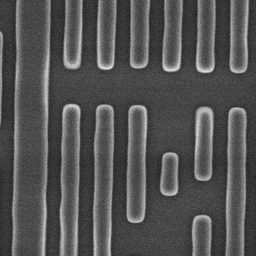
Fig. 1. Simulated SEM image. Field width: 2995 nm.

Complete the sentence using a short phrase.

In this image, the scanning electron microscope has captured groups of lines, slits or small figures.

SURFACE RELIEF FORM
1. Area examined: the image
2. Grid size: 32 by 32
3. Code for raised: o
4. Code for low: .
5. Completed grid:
..oooo..oo..oo..ooo..oo..oo..oo.
..oooo..oo..oo..ooo..oo..oo..oo.
..oooo..oo..oo..ooo..oo..oo..oo.
..oooo..oo..oo..ooo..oo..oo..oo.
..oooo..oo..oo..ooo..oo..oo..oo.
..oooo..oo..oo..ooo.ooo..oo..oo.
..oooo..oo..oo..oo..ooo..oo..oo.
..oooo..oo..oo..oo..oo...oo..oo.
..oooo.......o.......o...oo..oo.
..oooo..........................
..oooo..........................
..oooo..........................
..oooo..........................
..oooo..oo..oo..oo..............
..oooo..oo..oo..oo.......o...oo.
..oooo..oo..oo..oo.......oo..oo.
..oooo..oo..oo..oo.......oo..oo.
..oooo..oo..oo..oo.......o...oo.
..oooo..oo..oo..oo.......o...oo.
..oooo..oo..oo..oo...o..oo...oo.
..oooo..oo..oo..oo..oo..oo...oo.
..oooo..oo..oo..oo..oo..oo...oo.
..oooo..oo..oo..oo..oo...o...oo.
..oooo..oo..oo..oo..oo......ooo.
..oooo..oo..oo..oo..........ooo.
..oooo..oo..oo..oo..........ooo.
..oooo..oo..oo..oo..........oo..
..oooo..oo..oo..oo......oo..oo..
..oooo..oo..oo..........oo..oo..
..oooo..oo..oo..........oo..oo..
..ooo...oo..oo..........oo..oo..
..ooo...oo..oo..........oo..oo..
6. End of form